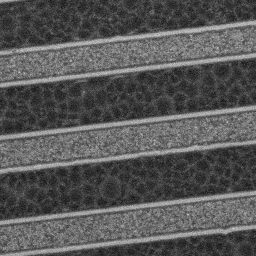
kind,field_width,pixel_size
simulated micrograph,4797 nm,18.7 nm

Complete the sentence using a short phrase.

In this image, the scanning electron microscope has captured one or a few lines or trenches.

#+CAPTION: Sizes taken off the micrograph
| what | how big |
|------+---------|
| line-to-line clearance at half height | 977 nm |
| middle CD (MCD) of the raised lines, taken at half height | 621 nm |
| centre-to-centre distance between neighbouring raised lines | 1.59 µm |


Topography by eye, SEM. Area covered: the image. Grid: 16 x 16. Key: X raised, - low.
----------------
---------------X
-------XXXXXXXXX
XXXXXXXXXXXXXXXX
XXXXXXX---------
----------------
----------------
---------XXXXXXX
-XXXXXXXXXXXXXXX
XXXXXXXXXX------
XX--------------
----------------
------------XXXX
----XXXXXXXXXXXX
XXXXXXXXXXXXX---
XXXXX-----------